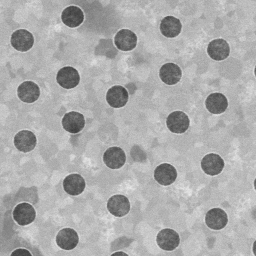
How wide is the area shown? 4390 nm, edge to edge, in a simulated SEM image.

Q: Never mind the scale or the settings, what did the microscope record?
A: a regular array of holes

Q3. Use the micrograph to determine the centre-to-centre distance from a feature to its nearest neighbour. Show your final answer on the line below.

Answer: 824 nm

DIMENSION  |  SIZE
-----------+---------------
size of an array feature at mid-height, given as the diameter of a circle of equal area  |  402 nm